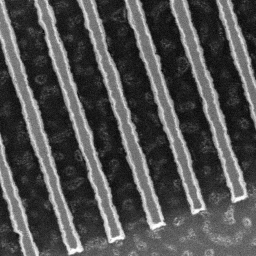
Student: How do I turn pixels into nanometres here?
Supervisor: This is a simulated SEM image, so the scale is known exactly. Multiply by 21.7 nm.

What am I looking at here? parallel lines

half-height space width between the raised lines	681	nm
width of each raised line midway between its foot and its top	272	nm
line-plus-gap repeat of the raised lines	940	nanometers